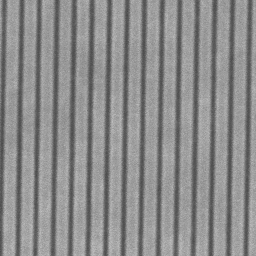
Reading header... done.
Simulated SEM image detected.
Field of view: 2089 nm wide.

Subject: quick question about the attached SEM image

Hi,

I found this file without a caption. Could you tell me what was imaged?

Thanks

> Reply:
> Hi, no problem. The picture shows parallel lines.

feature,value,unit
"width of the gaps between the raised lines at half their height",43.8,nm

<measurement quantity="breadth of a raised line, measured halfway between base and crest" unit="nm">96.8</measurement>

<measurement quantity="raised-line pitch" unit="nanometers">143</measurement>